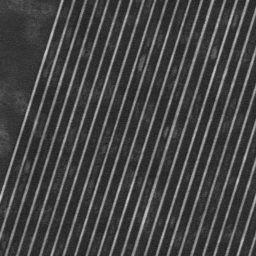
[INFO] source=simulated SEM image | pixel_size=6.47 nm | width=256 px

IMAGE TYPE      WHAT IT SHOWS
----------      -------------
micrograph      parallel lines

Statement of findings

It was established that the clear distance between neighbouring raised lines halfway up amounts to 0.0571 micrometres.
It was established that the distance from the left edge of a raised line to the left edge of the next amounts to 71.6 nanometers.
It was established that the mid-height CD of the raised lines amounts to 1.78 pixels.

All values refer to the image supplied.